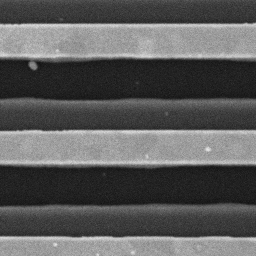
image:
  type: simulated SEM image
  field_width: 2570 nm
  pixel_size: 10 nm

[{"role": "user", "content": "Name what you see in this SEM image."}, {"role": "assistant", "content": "lines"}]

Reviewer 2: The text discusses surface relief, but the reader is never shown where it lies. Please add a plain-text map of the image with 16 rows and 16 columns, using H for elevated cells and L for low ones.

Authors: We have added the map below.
HHHHHHHHHHHHHHHH
HHHHHHHHHHHHHHHH
HHHHHHHHHHHHHHHH
HHHHHHHHHHHHHHHH
LLLLLLLLLLLLLLLL
LLLLLLLLLLLLLLLL
HHHHHHHHHHHHHHHH
HHHHHHHHHHHHHHHH
HHHHHHHHHHHHHHHH
HHHHHHHHHHHHHHHH
LLLLLLLLLLLLLLLL
LLLLLLLLLLLLLLLL
LLLLLLLLLLLLLLLL
HHHHHHHHHHHHHHHH
HHHHHHHHHHHHHHHH
HHHHHHHHHHHHHHHH